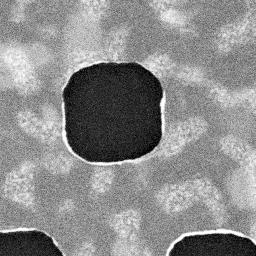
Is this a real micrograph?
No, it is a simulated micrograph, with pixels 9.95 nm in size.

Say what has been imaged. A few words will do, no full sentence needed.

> holes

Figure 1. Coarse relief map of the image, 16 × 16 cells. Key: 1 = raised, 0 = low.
1111111111111111
1111111111111111
1111111111111111
1111111111111111
1111100001111111
1111000000111111
1111000000111111
1111000000111111
1111000000111111
1111100001111111
1111111111111111
1111111111111111
1111111111111111
1111111111111111
0001111111111011
0000111111100000